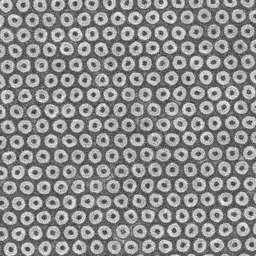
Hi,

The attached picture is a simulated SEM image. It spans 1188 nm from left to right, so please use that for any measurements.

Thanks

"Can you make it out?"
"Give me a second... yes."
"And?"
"a regular array of ring-shaped raised bodies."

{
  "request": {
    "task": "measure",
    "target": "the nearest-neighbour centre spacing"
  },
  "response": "77.8 nanometers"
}